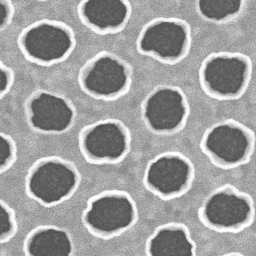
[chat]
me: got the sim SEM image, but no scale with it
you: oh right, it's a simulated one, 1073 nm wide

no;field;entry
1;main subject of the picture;a regular array of holes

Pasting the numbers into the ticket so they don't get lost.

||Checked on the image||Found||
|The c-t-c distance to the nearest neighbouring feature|276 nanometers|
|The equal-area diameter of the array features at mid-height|0.172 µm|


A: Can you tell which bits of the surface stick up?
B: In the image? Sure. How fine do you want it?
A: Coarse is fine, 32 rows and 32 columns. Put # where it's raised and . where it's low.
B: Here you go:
.##########.....#########.....##
.#########......#########.....##
.##########....############.####
####...#####.######....#########
###......#########.....#########
###......#########.....#########
###.....###########....#########
#####.######...###########....##
###########.....##########.....#
.#########......#########......#
.#########......##########....##
###########....####...#####...##
####....##########.....#########
####.....#########.....#########
####.....#########.....#########
####.....####..####...##########
###########.....##########.....#
.#########......##########.....#
.##########.....##########.....#
.##########....############....#
.####...###########....#########
####.....##########.....########
####.....#########.....#########
####.....##########....#########
#####...######.###########....##
############....##########.....#
.##########......#########.....#
.##########.....##########.....#
.###########...#################
.###.....##########....#########
####.....##########.....########
####.....##########.....########